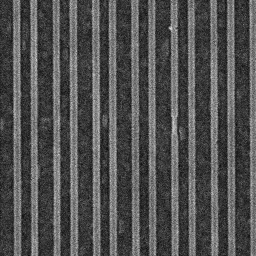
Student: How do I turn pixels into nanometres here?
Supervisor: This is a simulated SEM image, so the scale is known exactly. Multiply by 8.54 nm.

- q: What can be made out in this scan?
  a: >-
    parallel lines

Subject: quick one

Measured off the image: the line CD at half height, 57.7 nm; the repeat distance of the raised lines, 166 nm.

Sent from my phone